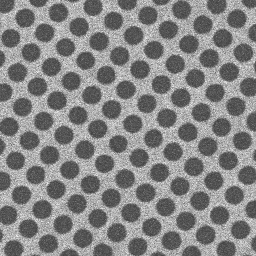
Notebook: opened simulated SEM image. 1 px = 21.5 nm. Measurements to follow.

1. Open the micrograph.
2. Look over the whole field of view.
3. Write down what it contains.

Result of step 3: a regular array of holes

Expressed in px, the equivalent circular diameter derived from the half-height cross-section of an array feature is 19.3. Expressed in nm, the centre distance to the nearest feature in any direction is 518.